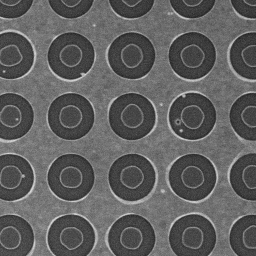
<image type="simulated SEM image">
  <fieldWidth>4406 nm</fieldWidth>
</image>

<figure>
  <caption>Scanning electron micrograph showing an array of small figures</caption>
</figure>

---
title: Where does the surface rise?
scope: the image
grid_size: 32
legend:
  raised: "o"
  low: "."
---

....oo......oo.....oo......oo...
...oooo....ooo.....ooo....oooo..
oooooooooooooooooooooooooooooooo
oooooooooooooooooooooooooooooooo
...oooo...ooooo...oooo....oooo..
....oo.....ooo.....oo......oo...
....oo......o......oo......oo...
....oo......o......oo......oo...
....oo.....ooo.....oo......oo...
...oooo...ooooo...oooo....oooo..
oooooooooooooooooooooooooooooooo
oooooooooooooooooooooooooooooooo
...oooo....ooo.....ooo....oooo..
....oo......oo.....oo......oo...
....oo......oo......o......oo...
....oo......oo......o......oo...
...oooo....ooo.....ooo....ooo...
..oooooooooooooo.ooooooooooooo..
oooooooooooooooooooooooooooooooo
..oooooo..ooooo...ooooo..ooooo..
....oo.....ooo.....oo......oo...
....oo......oo......o......oo...
....oo......oo......o......oo...
....oo......oo.....oo......oo...
...oooo....ooo.....ooo....oooo..
oooooooooooooooooooooooooooooooo
oooooooooooooooooooooooooooooooo
...oooo....oooo...oooo....oooo..
....oo......oo.....oo......oo...
....oo......o......oo......oo...
....oo......o......oo......oo...
....oo.....ooo.....ooo....ooo...